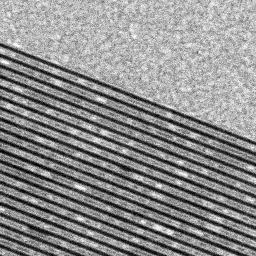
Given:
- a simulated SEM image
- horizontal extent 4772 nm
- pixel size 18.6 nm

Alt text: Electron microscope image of parallel lines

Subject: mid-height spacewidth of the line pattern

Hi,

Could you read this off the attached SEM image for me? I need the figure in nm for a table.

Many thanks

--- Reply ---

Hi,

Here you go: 67.3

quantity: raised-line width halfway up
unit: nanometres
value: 115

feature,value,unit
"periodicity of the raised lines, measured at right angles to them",0.184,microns